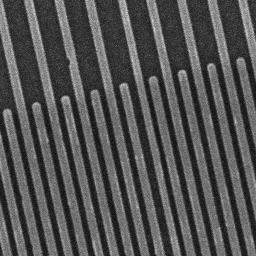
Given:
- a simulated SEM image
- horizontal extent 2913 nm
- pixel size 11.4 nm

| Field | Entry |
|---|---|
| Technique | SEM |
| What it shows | parallel lines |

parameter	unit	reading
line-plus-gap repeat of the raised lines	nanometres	170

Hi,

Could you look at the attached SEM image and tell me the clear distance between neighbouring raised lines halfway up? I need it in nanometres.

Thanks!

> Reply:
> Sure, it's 83.4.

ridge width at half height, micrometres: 0.0834